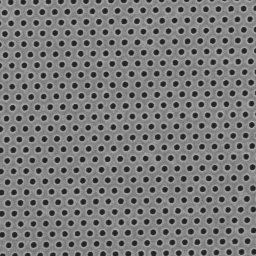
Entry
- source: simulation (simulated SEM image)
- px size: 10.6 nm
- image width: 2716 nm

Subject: a regular array of holes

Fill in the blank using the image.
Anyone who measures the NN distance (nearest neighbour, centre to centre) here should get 128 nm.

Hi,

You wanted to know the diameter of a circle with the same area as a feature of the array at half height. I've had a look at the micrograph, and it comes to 61 nm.